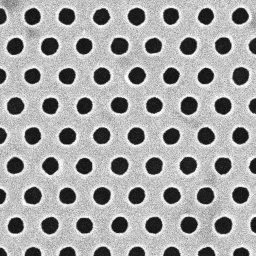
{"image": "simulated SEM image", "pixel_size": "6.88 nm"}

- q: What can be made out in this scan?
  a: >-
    a regular array of holes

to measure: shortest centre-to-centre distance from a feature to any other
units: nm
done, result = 234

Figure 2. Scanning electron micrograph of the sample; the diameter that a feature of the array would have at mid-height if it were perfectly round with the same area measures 0.118 microns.